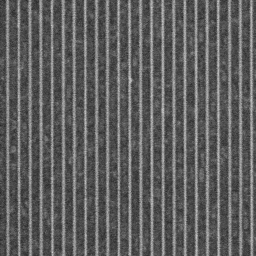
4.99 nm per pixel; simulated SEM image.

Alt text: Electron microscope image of parallel lines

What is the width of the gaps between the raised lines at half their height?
46.2 nanometres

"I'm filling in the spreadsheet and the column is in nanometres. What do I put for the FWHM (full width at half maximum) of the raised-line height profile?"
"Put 11.2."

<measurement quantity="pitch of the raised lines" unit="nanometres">55.3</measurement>